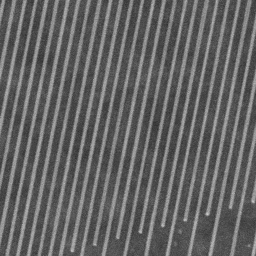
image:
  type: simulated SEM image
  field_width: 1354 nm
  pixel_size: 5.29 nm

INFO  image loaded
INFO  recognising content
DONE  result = parallel lines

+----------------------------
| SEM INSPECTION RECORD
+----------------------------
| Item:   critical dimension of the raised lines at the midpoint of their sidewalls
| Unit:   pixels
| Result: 2.95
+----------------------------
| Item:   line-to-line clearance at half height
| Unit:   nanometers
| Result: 41.5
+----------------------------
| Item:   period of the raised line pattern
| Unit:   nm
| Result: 55.5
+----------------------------